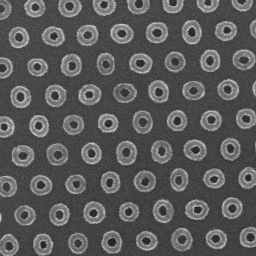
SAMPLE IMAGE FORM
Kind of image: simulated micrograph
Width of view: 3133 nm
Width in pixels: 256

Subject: a regular array of ring-shaped raised bodies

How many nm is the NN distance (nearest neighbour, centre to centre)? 410